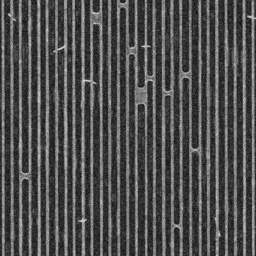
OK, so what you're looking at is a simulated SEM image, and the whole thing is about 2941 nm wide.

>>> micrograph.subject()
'parallel lines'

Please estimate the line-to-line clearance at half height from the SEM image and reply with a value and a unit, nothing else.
76.1 nm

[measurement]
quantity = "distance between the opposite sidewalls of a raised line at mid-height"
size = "0.0273 microns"